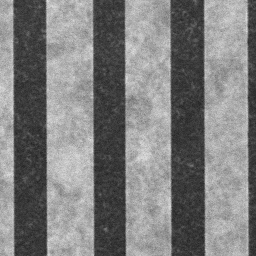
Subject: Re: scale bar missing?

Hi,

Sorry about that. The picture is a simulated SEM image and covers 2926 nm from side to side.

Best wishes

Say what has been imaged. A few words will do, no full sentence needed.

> one or a few lines or trenches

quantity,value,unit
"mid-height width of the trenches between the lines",0.376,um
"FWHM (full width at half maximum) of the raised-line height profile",0.51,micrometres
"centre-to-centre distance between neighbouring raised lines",892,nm